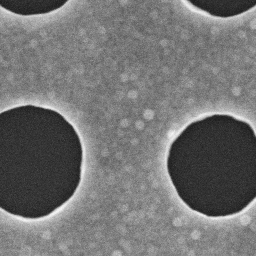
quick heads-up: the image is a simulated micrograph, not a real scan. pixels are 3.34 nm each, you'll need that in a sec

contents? holes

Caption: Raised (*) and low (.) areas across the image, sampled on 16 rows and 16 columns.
....********....
****************
****************
****************
****************
****************
****************
....********...*
.....******.....
.....*****......
.....*****......
.....******.....
....*******.....
*..**********.**
****************
****************